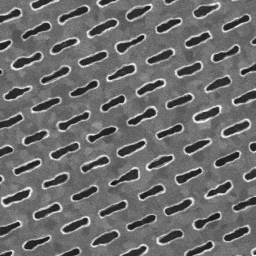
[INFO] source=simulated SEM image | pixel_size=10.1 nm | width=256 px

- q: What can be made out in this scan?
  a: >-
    a regular array of holes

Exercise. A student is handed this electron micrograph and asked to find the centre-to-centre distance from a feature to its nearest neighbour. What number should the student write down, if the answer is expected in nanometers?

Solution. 310